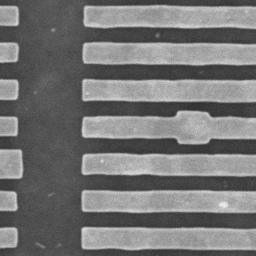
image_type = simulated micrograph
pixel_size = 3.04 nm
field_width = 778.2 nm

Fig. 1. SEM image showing wiring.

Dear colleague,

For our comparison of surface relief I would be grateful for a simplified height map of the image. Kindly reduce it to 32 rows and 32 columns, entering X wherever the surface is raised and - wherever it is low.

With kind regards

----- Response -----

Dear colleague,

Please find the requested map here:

--------------------------------
XX---------XXXXXXXXXXXXXXXXXXXXX
XX---------XXXXXXXXXXXXXXXXXXXXX
-------------------------------X
--------------------------------
XX---------XXXXXXXXXXX--XXX-----
XX--------XXXXXXXXXXXXXXXXXXXXXX
XX---------XXXXXXXXXXXXXXXXXXXXX
--------------------------------
--------------------------------
XX--------XXXXXXXXXXXXXXXXXXXXXX
XX--------XXXXXXXXXXXXXXXXXXXXXX
-----------XXXXXXXXXXXXXXXXXXXXX
--------------------------------
----------------------XXXX------
XX--------XXXXXXXXXXXXXXXXXXXXXX
XX--------XXXXXXXXXXXXXXXXXXXXXX
----------------------XXXX------
--------------------------------
XXX--------XXXXXXXXXXXXXXXXXXXXX
XXX-------XXXXXXXXXXXXXXXXXXXXXX
XXX-------XXXXXXXXXXXXXXXXXXXXXX
--------------------------------
--------------------------------
XX--------XXXXXXXXXXXXXXXXXXXXXX
XX--------XXXXXXXXXXXXXXXXXXXXXX
----------------XXX-------XXXXXX
--------------------------------
--------------------------------
XX--------XXXXXXXXXXXXXXXXXXXXXX
XX--------XXXXXXXXXXXXXXXXXXXXXX
--------------------------------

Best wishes